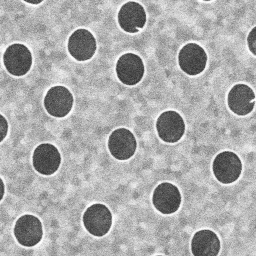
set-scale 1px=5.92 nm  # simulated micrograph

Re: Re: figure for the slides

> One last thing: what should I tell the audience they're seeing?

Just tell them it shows a regular array of holes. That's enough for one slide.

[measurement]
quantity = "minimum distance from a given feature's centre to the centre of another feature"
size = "348 nm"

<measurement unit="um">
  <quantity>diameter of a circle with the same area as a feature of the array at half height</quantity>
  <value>0.188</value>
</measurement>